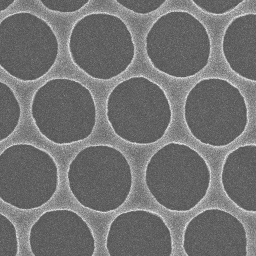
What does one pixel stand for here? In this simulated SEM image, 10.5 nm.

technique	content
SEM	holes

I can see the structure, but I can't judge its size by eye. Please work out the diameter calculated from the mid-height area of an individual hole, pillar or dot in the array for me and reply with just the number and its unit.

64.7 px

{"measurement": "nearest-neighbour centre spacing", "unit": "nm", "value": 792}